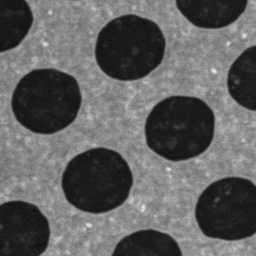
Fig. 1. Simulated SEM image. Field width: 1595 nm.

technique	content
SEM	holes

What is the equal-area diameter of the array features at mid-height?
426 nm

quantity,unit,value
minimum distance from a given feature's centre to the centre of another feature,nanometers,590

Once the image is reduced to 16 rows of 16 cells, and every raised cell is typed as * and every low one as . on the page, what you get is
..*********....*
..*****...**..**
.*****....******
******....*****.
**..***..*****..
*....*********..
*....*****...**.
*....****....***
*********....***
*****..***...***
****....********
****....*****...
****....****....
...*********....
...*****..***...
...****....*****